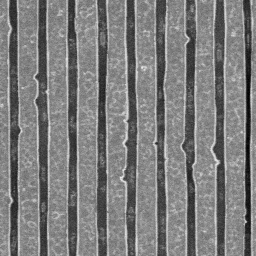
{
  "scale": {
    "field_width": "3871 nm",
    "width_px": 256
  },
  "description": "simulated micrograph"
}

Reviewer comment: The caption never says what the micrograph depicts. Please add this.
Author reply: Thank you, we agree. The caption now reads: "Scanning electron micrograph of parallel lines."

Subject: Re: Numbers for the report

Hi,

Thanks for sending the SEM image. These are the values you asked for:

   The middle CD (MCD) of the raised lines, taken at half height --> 0.308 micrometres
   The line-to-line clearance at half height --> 0.147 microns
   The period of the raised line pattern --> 446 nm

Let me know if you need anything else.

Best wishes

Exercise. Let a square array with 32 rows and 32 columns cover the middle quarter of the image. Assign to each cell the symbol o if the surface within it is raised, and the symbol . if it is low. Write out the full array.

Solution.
o..ooooo...ooooo..ooooo...oooo..
o...oooo...ooooo..ooooo...oooo..
o...oooo...ooooo..ooooo..ooooo..
o...oooo...ooooo..ooooo..ooooo..
o...oooo...ooooo..ooooo..ooooo..
o...oooo...ooooo..ooooo..ooooo..
o..ooooo...ooooo..ooooo..ooooo..
o..ooooo...ooooo..ooooo..ooooo..
o..ooooo...ooooo..ooooo..ooooo..
o...oooo...ooooo..ooooo..ooooo..
o...oooo...ooooo..ooooo..ooooo..
o...oooo...ooooo..ooooo..ooooo..
o...oooo...ooooo..ooooo..ooooo..
o...oooo...ooooo..ooooo..ooooo..
o...oooo...oooo...ooooo..ooooo..
o...oooo...ooooo..ooooo..ooooo..
o...oooo...ooooo...oooo..ooooo..
o..ooooo...ooooo...oooo..ooooo..
o..ooooo...ooooo...oooo..ooooo..
o..ooooo...oooo....oooo..ooooo..
o..ooooo...oooo...ooooo..oooo...
o...oooo...oooo...ooooo..ooooo..
o...oooo...oooo...ooooo..ooooo..
o...oooo...oooo...ooooo..ooooo..
o...oooo...oooo...ooooo..ooooo..
o...oooo...oooo...ooooo..ooooo..
o...oooo...oooo...ooooo..ooooo..
o...oooo...oooo...ooooo..ooooo..
o...oooo...oooo...ooooo..oooooo.
o...oooo...oooo...ooooo..oooooo.
o...oooo...ooooo..ooooo..oooooo.
o...oooo...ooooo..ooooo..oooooo.